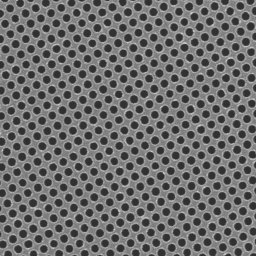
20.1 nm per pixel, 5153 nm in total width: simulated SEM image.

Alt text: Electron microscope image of a regular array of holes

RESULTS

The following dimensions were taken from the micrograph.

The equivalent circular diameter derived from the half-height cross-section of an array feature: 164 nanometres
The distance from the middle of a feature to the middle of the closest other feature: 0.227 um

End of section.